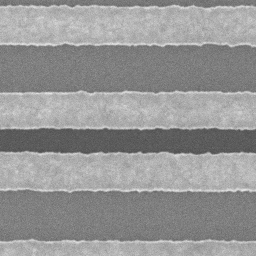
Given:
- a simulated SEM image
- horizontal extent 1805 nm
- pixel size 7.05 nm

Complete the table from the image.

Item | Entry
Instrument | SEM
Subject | lines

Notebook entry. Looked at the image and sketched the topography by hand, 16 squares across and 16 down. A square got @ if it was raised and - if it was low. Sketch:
@@@@@@@@@@@@@@@@
@@@@@@@@@@@@@@@@
@@@@@@@@@@@@@@@@
----------------
----------------
----------------
@@@@@@@@@@@@@@@@
@@@@@@@@@@@@@@@@
----------------
----------------
@@@@@@@@@@@@@@@@
@@@@@@@@@@@@@@@@
----------------
----------------
----------------
@@@@@@@@@@@@@@@@